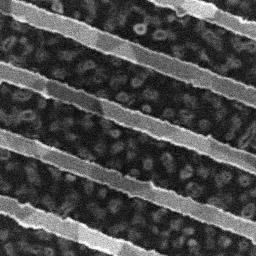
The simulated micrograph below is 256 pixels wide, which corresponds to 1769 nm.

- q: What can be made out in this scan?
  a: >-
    one or a few lines or trenches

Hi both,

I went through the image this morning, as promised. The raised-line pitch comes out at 62.5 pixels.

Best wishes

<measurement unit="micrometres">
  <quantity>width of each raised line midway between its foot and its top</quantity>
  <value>0.113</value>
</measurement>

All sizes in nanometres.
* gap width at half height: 321